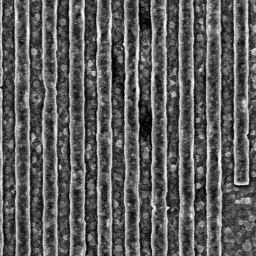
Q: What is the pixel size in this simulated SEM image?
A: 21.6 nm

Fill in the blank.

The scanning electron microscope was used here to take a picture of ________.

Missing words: parallel lines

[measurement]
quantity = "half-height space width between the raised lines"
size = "13 px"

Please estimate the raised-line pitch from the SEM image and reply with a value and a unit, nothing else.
590 nanometres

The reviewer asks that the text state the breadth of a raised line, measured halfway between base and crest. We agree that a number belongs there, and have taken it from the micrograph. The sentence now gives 300 nanometers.